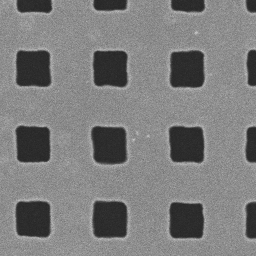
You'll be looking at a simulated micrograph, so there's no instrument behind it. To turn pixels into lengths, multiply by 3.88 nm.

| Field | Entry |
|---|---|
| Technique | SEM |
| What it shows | a regular array of holes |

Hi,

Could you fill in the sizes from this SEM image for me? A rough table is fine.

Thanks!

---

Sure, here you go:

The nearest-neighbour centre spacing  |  291 nm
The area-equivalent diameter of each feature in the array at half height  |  149 nanometres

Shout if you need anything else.